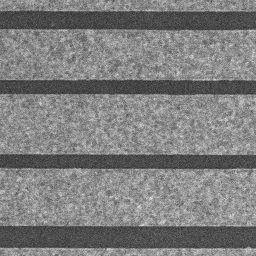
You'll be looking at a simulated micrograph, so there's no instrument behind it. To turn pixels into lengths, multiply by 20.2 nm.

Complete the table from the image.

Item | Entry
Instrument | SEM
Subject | one or a few lines or trenches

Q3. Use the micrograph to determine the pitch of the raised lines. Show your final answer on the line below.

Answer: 1440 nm